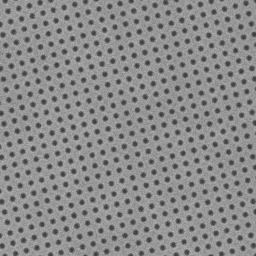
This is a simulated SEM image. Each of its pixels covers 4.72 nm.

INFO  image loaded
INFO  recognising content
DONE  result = a regular array of holes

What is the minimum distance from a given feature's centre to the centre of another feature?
50.1 nm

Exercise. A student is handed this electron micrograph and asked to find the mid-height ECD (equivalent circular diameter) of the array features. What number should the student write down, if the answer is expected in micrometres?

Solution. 0.0261